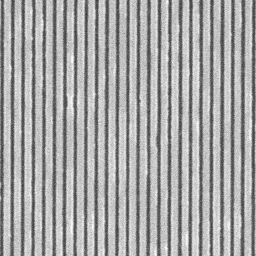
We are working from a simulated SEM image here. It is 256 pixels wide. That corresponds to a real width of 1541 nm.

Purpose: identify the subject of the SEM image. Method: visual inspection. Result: parallel lines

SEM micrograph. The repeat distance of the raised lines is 63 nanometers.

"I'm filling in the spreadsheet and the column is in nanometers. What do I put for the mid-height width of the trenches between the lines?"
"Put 25.6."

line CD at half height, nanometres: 36.1